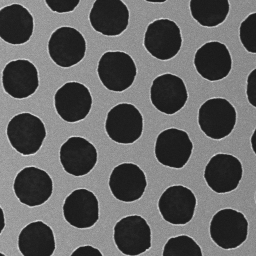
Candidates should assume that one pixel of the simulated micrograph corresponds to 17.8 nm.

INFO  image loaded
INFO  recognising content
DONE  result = a regular array of holes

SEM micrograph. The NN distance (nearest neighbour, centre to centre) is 950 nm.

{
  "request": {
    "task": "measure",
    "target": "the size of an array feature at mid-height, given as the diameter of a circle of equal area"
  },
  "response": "0.686 µm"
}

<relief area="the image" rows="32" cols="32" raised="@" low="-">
@@@@@@----@@----@@@@@@@@-----@@@
----@@@-@@@-----@@@@@@@@-----@@@
----@@@@@@@-----@@@@-@@@----@@@-
----@@@@-@@@----@@----@@@@@@@@--
----@@----@@@@@@@@-----@@@@@@@--
@@@@@@-----@@@@@@@-----@@@--@@--
@@@@@@-----@@@-@@@@---@@@----@@-
@@-@@@@---@@@----@@@@@@@-----@@@
@---@@@@@@@@-----@@@@@@@@----@@@
-----@@@@@@@-----@@@--@@@---@@@-
-----@@@--@@@---@@@----@@@@@@@@-
@---@@@----@@@@@@@@----@@@@@@@@-
@@@@@@@----@@@@@@@@----@@@--@@@-
@@@@@@@----@@@---@@@---@@----@@@
@@--@@@@---@@-----@@@@@@@-----@@
@----@@@@@@@@-----@@@@@@@----@@@
@-----@@@@@@@-----@@---@@----@@@
@----@@@---@@@---@@@----@@@@@@@-
@@---@@@----@@@@@@@-----@@@@@@@@
@@@@@@@-----@@@@@@@-----@@@--@@@
@@@@@@@@----@@@--@@@---@@@----@@
@@----@@---@@@----@@@@@@@@----@@
@@----@@@@@@@@----@@@@@@@@----@@
@@-----@@@@@@@----@@@--@@@---@@@
@@----@@@---@@----@@----@@@@@@@@
@@@--@@@----@@@@@@@@----@@@@@@@@
@@@@@@@@----@@@@@@@@----@@@---@@
-@@@@@@@----@@@---@@@---@@-----@
@@@---@@@@@@@@-----@@@@@@@-----@
@@-----@@@@@@@-----@@@@@@@-----@
@@-----@@@@@@@-----@@----@@---@@
@@@----@@---@@@---@@-----@@@@@@@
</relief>